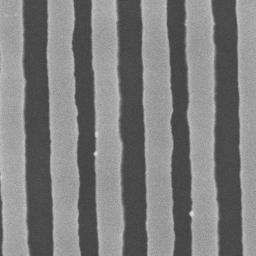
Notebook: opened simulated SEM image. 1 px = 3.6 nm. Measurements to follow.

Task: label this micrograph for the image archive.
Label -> lines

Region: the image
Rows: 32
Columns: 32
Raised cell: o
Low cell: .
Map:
ooo...ooo...ooo...ooo..ooo....oo
ooo...ooo...ooo...ooo..ooo....oo
ooo...ooo...ooo...ooo..oooo...oo
ooo...ooo...ooo...ooo..oooo...oo
ooo...ooo...ooo...ooo..oooo...oo
ooo...ooo...ooo...ooo..oooo...oo
ooo...ooo...ooo...ooo..oooo...oo
ooo...ooo...ooo...ooo..oooo...oo
ooo...ooo...ooo...ooo...ooo...oo
ooo...ooo...ooo...ooo...ooo...oo
ooo...ooo...ooo...ooo...ooo...oo
ooo...ooo...ooo...ooo...ooo...oo
ooo...ooo...ooo...ooo...ooo...oo
ooo...oooo..ooo...oooo..ooo...oo
ooo...oooo..ooo...ooo..oooo...oo
ooo...oooo..ooo...ooo...ooo...oo
ooo...oooo..ooo...ooo...ooo...oo
ooo...oooo..ooo...oooo..ooo...oo
ooo...oooo..ooo...oooo..ooo...oo
ooo...oooo..ooo...ooo...ooo...oo
ooo...oooo..ooo...ooo...ooo...oo
ooo...oooo..ooo...ooo...ooo...oo
ooo...oooo..ooo...ooo...ooo...oo
ooo...oooo..ooo...ooo...ooo...oo
ooo....ooo..ooo...ooo...ooo...oo
ooo....ooo..ooo...oooo..ooo...oo
ooo....ooo..ooo...oooo..ooo...oo
ooo....ooo..ooo...oooo..ooo...oo
ooo....ooo..ooo...oooo..ooo...oo
ooo....ooo..ooo...oooo..ooo...oo
ooo....ooo..ooo...oooo..ooo...oo
oooo...ooo..ooo...oooo..ooo...oo